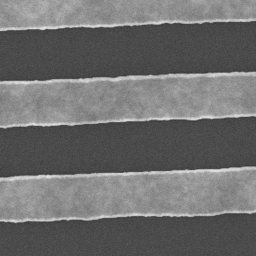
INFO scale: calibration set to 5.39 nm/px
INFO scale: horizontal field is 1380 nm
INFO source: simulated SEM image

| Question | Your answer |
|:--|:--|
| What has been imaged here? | lines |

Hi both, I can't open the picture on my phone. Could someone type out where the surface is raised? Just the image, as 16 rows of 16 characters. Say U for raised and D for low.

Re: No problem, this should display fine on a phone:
UUUUUUUUUUUUUUUU
UUUUUUUUUUDDDDDD
DDDDDDDDDDDDDDDD
DDDDDDDDDDDDDDDD
DDDDDDDDDDDDDDDD
UUUUUUUUUUUUUUUU
UUUUUUUUUUUUUUUU
UUUUUUUUUDDDDDDD
DDDDDDDDDDDDDDDD
DDDDDDDDDDDDDDDD
DDDDDDDDDDDDDDDU
UUUUUUUUUUUUUUUU
UUUUUUUUUUUUUUUU
UUUUUUUUUUUUUDDD
DDDDDDDDDDDDDDDD
DDDDDDDDDDDDDDDD